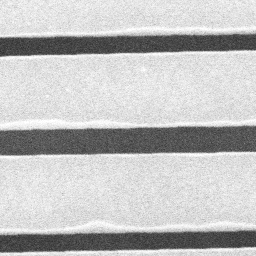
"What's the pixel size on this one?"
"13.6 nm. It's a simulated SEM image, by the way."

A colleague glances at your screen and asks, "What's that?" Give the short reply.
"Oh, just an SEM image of lines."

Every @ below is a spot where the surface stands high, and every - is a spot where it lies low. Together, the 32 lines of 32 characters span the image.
@@@@@@@@@@@@@@@@@@@@@@@@@@@@@@@@
@@@@@@@@@@@@@@@@@@@@@@@@@@@@@@@@
@@@@@@@@@@@@@@@@@@@@@@@@@@@@@@@@
@@@@@@@@@@@@@@@@@@@@@@@@@@@@@@@@
--------------------------------
--------------------------------
-----------------------------@@@
@@@@@@@@@@@@@@@@@@@@@@@@@@@@@@@@
@@@@@@@@@@@@@@@@@@@@@@@@@@@@@@@@
@@@@@@@@@@@@@@@@@@@@@@@@@@@@@@@@
@@@@@@@@@@@@@@@@@@@@@@@@@@@@@@@@
@@@@@@@@@@@@@@@@@@@@@@@@@@@@@@@@
@@@@@@@@@@@@@@@@@@@@@@@@@@@@@@@@
@@@@@@@@@@@@@@@@@@@@@@@@@@@@@@@@
@@@@@@@@@@@@@@@@@@@@@@@@@@@@@@@@
@@@@@@@@@@@@@@@@@@@@@@@@@-------
--------------------------------
--------------------------------
--------------------------------
----@@@@@@@@@@@@@@@@@@@@@@@@@@@@
@@@@@@@@@@@@@@@@@@@@@@@@@@@@@@@@
@@@@@@@@@@@@@@@@@@@@@@@@@@@@@@@@
@@@@@@@@@@@@@@@@@@@@@@@@@@@@@@@@
@@@@@@@@@@@@@@@@@@@@@@@@@@@@@@@@
@@@@@@@@@@@@@@@@@@@@@@@@@@@@@@@@
@@@@@@@@@@@@@@@@@@@@@@@@@@@@@@@@
@@@@@@@@@@@@@@@@@@@@@@@@@@@@@@@@
@@@@@@@@@@@@@@@@@@@@@@@@@@@@@@@@
@@@@@@@@@@@@-@@@@@@@@@@@@@------
--------------------------------
--------------------------------
--------@@@@@@@@@@@@@@@@@@@@@@@@